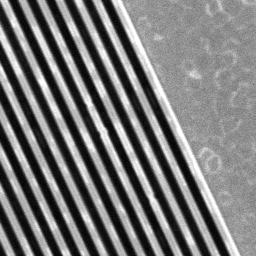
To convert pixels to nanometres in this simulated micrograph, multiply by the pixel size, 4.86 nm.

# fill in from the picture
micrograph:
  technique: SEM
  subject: parallel lines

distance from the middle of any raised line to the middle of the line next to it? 82 nanometers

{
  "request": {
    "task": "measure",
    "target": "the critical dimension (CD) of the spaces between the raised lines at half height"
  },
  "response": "42.4 nm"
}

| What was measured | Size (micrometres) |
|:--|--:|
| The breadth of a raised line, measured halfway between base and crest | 0.038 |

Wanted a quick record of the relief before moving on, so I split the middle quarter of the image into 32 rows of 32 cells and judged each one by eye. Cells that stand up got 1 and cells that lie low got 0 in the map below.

01100111001100011001100000000000
01100011001110011000110000000000
00110011000110001100110000000000
00110001100111001100011000000000
00011001100011000110011000000000
10011000110011100110001100000000
10001100110001100011001100000000
11001100011001110011000110000000
11000110011000110001100110000000
11100110001100111001100011000000
01100011001100011001110011000000
01110011000110011000110001100000
00110011100110001100110001100000
00110001100011001100011001110000
00011001100011000110011000110000
10011000110011100110001100111000
10001100111001100111001100011000
11001100011001100011000110011100
11001110011000110011100110001100
11000110001100110001100011001100
01100111001100011001110011000110
01100011000110011000110001100110
00110011100110001100111001100011
00110001100011001100011000110011
00011001110011000110011100110001
10011000110001100110001100111001
10001100111001100011001100011000
11001100011001110011000110011000
11000110011000110001100110001100
11100110001100110001100011001100
01100011001100011001110011000110
01100011000110011000110011100110